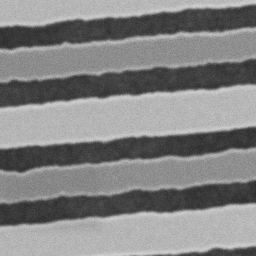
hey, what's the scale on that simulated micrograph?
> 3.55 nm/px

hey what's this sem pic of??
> lines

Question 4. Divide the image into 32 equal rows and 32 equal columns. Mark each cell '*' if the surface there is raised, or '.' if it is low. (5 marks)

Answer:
*******************************.
********************............
*********.......................
................................
...................*************
........*.**********************
********************************
*******************************.
*******************.............
*********.......................
................................
......................**********
.........***********************
********************************
********************************
********************************
*************************.......
**************..................
**..............................
.........................*******
............********************
*..*****************************
********************************
*********************.*.........
*******.........................
................................
..................*...**********
.........***********************
********************************
********************************
********************************
************************........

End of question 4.